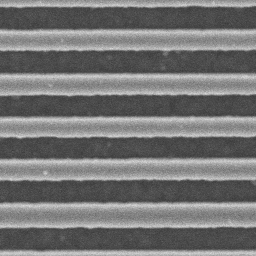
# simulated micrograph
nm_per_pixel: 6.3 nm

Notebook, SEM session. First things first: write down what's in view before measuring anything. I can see lines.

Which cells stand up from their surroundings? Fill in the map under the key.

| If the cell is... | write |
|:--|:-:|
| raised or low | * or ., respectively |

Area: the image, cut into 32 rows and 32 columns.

********************************
................................
................................
................................
********************************
********************************
................................
................................
................................
********************************
********************************
********************************
................................
................................
................................
********************************
********************************
................................
................................
................................
********************************
********************************
********.**.***.......*...**....
................................
................................
********************************
********************************
********************************
*......*...*....................
................................
................................
********************************